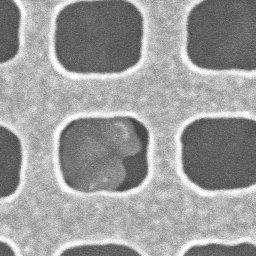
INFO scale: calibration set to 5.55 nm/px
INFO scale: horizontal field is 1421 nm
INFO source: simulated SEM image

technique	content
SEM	holes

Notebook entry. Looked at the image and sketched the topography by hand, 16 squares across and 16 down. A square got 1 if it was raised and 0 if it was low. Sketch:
0111000001110000
0110000001110000
0110000001110000
0110000001110000
1111000011111110
1111111111111111
1111111111111111
1111100001110000
0111000001100000
0111000001100000
0111000001100000
0111000001110000
1111111111111111
1111111111111111
1111111111111111
0111000011110000